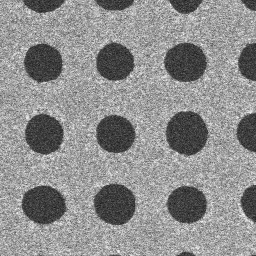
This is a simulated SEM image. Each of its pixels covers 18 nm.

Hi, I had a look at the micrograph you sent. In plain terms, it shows a regular array of holes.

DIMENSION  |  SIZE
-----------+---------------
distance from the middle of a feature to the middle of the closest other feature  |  1.27 µm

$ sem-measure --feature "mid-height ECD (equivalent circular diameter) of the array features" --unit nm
717